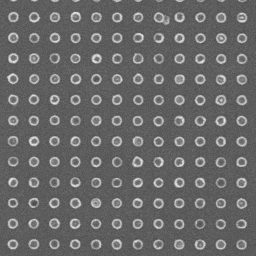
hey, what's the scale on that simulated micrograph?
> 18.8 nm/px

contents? a regular array of raised bodies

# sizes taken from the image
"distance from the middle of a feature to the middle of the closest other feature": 383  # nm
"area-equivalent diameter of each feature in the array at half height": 9.61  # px